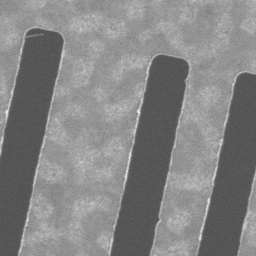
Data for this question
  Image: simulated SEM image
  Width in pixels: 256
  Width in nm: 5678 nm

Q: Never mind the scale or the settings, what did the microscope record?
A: one or a few lines or trenches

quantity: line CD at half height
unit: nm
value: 924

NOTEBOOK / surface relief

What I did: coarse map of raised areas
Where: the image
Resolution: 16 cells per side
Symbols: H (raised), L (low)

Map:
LLLLLLLLLLLLLLLL
LLLLLLLLLLLLLLLL
LHHHLLLLLLLLLLLL
LHHHLLLLLLHLLLLL
LHHHLLLLLHHHLLLL
LHHHLLLLLHHHLLLH
LHHLLLLLLHHLLLHH
HHHLLLLLLHHLLLHH
HHHLLLLLHHHLLLHH
HHHLLLLLHHHLLLHH
HHLLLLLLHHHLLHHH
HHLLLLLLHHLLLHHH
HHLLLLLLHHLLLHHH
HHLLLLLHHHLLLHHL
HHLLLLLHHHLLLHHL
HLLLLLLHHHLLHHHL